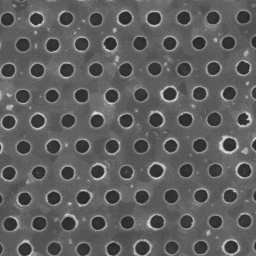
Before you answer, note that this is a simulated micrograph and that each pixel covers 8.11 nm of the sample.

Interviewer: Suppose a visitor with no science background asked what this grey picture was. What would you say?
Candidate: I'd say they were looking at a regular array of holes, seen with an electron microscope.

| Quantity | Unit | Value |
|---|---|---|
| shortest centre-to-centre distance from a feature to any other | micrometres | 0.235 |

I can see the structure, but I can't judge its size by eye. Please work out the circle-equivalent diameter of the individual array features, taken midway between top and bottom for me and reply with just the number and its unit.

13.7 pixels